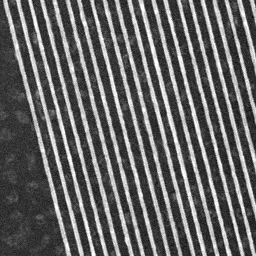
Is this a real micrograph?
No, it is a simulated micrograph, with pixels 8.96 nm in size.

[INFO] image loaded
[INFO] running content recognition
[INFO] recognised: parallel lines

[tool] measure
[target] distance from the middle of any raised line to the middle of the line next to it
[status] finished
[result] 107 nm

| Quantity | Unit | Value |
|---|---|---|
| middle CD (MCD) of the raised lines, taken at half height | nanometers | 22.9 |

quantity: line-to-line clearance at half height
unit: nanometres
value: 80.4